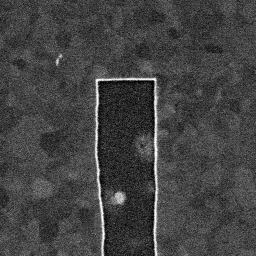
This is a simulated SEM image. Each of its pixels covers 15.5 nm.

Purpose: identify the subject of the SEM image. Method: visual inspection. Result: one or a few lines or trenches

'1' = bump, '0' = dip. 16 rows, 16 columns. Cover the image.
1111111111111111
1111111111111111
1111111111111111
1111111111111111
1111111111111111
1111110000111111
1111110000111111
1111110000111111
1111110000111111
1111110000111111
1111110000111111
1111110000111111
1111110000111111
1111110000111111
1111110000111111
1111110000111111